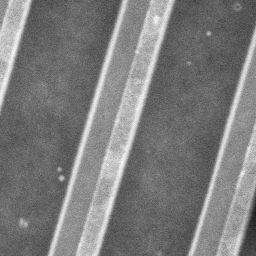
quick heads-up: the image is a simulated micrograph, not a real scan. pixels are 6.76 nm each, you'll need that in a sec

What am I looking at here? lines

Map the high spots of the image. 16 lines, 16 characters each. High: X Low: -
XX------XX------
X------XXX------
X------XXX------
X------XXX------
-------XX------X
------XXX------X
------XXX------X
------XX------XX
-----XXX------XX
-----XXX------XX
-----XXX------XX
----XXX------XXX
----XXX------XXX
----XXX------XX-
----XX------XXX-
---XXX------XXX-